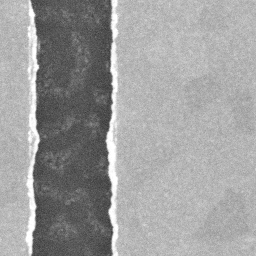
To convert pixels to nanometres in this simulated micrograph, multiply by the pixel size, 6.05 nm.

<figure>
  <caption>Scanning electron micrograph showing one or a few lines or trenches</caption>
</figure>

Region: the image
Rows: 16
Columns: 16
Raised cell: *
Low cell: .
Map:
**.....*********
**.....*********
**.....*********
**.....*********
**.....*********
**.....*********
**.....*********
**.....*********
**.....*********
**.....*********
**.....*********
**.....*********
**.....*********
**.....*********
**.....*********
**.....*********